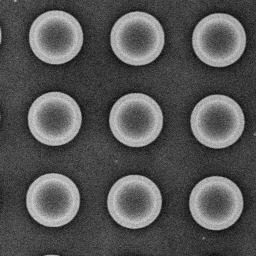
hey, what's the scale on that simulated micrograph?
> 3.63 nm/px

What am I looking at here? an array of small figures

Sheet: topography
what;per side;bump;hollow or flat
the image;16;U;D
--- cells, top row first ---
DDDDDDDDDDDDDDDD
DDUUUDDUUUDDUUUD
DDUUUDDUUUDDUUUD
DDUUUDDUUUDDUUUD
DDDDDDDDDDDDDDDD
DDDDDDDDDDDDDDDD
DDUUUDDUUUDDUUUD
DDUUUDDUUUDDUUUD
DDUUUDDUUUDDUUUD
DDDDDDDDDDDDDDDD
DDDDDDDDDDDDDDDD
DDUUUDDUUUDDUUUD
DDUUUDDUUUDDUUUD
DDUUUDDUUUDDUUUD
DDDDDDDDDDDDDDDD
DDDDDDDDDDDDDDDD